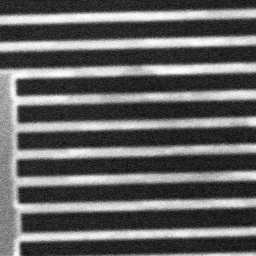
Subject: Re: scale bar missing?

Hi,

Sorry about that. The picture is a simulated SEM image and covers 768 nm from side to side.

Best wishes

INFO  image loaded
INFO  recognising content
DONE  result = parallel lines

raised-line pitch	81.6	nanometres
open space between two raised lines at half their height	59.2	nanometers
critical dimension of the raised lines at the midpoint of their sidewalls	21	nanometers